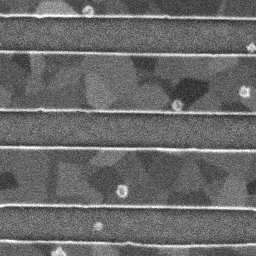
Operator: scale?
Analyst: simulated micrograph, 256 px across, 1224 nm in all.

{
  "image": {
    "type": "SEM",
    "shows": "one or a few lines or trenches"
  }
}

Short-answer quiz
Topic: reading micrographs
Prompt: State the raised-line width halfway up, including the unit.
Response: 58.2 pixels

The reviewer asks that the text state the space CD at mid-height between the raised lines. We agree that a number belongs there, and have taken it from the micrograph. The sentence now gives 35.9 pixels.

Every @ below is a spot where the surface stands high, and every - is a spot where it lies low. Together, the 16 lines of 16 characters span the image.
@@@@@@@@@@@@@@@@
----------------
----------------
@@@@@@@@@@@@@@@@
@@@@@@@@@@@@@@@@
@@@@@@@@@@@@@@@@
@@@@@@@@@@@@@@@@
----------------
----------------
@@@@@@@@@@@@@@@@
@@@@@@@@@@@@@@@@
@@@@@@@@@@@@@@@@
@@@@@@@@@@@@@@@@
----------------
----------------
@@@@@@@@@@@@@@@@